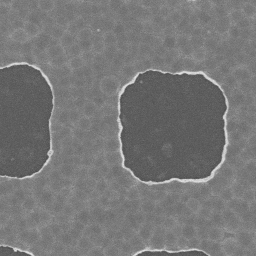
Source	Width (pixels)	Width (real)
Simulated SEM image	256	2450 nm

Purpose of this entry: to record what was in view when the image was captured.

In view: holes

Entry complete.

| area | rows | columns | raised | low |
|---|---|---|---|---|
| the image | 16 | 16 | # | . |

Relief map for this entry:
################
################
################
################
...######.######
...#####......##
...####.......##
...####.......##
...#####......##
...#####......##
...#####......##
################
################
################
################
.###############